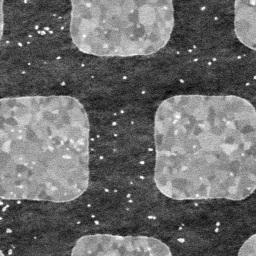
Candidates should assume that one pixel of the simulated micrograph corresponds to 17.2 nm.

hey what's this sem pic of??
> raised bodies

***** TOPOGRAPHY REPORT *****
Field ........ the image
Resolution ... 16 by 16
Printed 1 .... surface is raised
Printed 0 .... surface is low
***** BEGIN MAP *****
0000011111100001
0000111111100001
0000011111000001
0000000000000000
0000000000000000
0000000000000000
1111100000111111
1111100000111111
1111110000111111
1111110000111111
1111100000111111
1111100000111111
0001000000000000
0000000000000000
0000000000000000
0000011111000001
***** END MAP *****